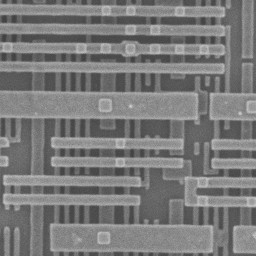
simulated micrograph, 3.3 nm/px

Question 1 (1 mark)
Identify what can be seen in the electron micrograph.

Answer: wiring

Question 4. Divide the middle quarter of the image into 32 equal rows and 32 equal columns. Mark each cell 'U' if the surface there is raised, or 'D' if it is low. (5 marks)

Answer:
UUUUUUUUUUUUUUUUUUUUUUUUUUUUUUUU
UUUUUUUUUUUUUUUUUUUUUUUUUUUUUUUU
DDDDDDDDDDDDDDDDDDDDDDDDDDDDDDDD
DDDDDDDDDDDDDDDDDDDDDDDDDDDDDDDD
DDDDDDDDDDDDDDDDDDDDDDDDDDDDDDDD
DDDDDDDDDDDDDDDDDDDDDDDDDDDDDDDD
DDDDDDDDDDDDDDDDDDDDDDDDDDDDDDDD
UUUUUUUUUUUUUUUUUUUUUUUUUUUUUUUU
UUUUUUUUUUUUUUUUUUUUUUUUUUUUUUUU
UUUUUUUUUUUUUUUUUUUUUUUUUUUUUUUU
UUUUUUUUUUUUUUUUUUUUUUUUUUUUUUUU
UUUUUUUUUUUUUUUUUUUUUUUUUUUUUUUU
UUUUUUUUUUUUUUUUUUUUUUUUUUUUUUUU
UUUUUUUUUUUUUUUUUUUUUUUUUUUUUUUU
DDDDDDDDDDDDDDDDDDDDDDDDDDDDDDDD
DDDDDDDDDDDDDDDDDDDDDDDDDDDDDDDD
DDDDDDDDDDDDDDDDDDDDDDDDDDDDDDDD
DDDDDDDDDDDDDDDDDDDDDDDDDDDDDDDD
DDDDDDDDDDDDDDDDDDDDDDDDDDDDDDDD
UUUUUUUUUUUUUUUUUUUUUUUUUUUUUUDD
UUUUUUUUUUUUUUUUUUUUUUUUUUUUUUDD
DDDDDDDDDDDDDDDDDDDDDDDDDDDDDDDD
DDDDDDDDDDDDDDDDDDDDDDDDDDDDDDDD
UUUUUUUUUUUUUUUUUDDDDDUUUDDDDDDD
UUUUUUUUUUUUUUUUUUUUUUUUUUUUUUDD
UUUUUUUUUUUUUUUUUUUUUUUUUUUUUUDD
DDDDDDDDDDDDDDDDDDDDDDDDDDDDDDDD
DDDDDDDDDDDDDDDDDDDDDDDDDDDDDDDD
UUUUUUUUUUUUUUUUUUUDDDDDDDDDDDUU
UUUUUUUUUUUUUUUUUUUDDDDDDDDDDDUU
DDDDDDDDDDDDDDDDDUUDDDDDDDDDDDUU
DDDDDDDDDDDDDDDDDDDDDDDDDDDDDDUU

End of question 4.